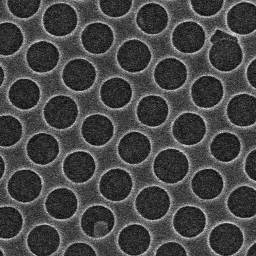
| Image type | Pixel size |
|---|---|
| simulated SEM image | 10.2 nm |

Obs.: a regular array of holes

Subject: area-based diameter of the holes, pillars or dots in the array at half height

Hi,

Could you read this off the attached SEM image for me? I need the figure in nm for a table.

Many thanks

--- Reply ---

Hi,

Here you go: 334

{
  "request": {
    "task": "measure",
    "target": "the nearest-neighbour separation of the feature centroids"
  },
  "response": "0.415 µm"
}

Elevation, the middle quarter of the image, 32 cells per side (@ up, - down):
-------@@@@@@@-------@@-------@@
--------@@@@@@@-----@@@--------@
--------@@@@@@@@@@@@@@---------@
--------@@@@--@@@@@@@@---------@
--------@@------@@@@@@@-------@@
@------@@--------@@@@@@@-----@@@
@@----@@@--------@@@@@@@@--@@@@@
@@@@@@@@@--------@@@@@@@@@@@@@@@
--@@@@@@@--------@@@-----@@@@@@@
---@@@@@@@------@@@-------@@@@@@
---@@@@@@@@----@@@--------@@@@@@
---@@@@@@@@@@@@@@@--------@@@@@@
---@@@@@@@@@@@@@@@--------@@@---
---@@@-----@@@@@@@--------@@----
---@@-------@@@@@@@------@@-----
--@@--------@@@@@@@@@---@@@-----
@@@@--------@@@@@@@@@@@@@@@-----
@@@@--------@@@@----@@@@@@@-----
@@@@@-------@@@------@@@@@@@----
@@@@@@-----@@@--------@@@@@@@---
@@@@@@@@-@@@@---------@@@@@@@@@@
@@@@@@@@@@@@@---------@@@----@@@
@-----@@@@@@@@-------@@@------@@
-------@@@@@@@-------@@--------@
--------@@@@@@@----@@@---------@
--------@@@@@@@@@@@@@@---------@
--------@@@----@@@@@@@---------@
-------@@@------@@@@@@@--------@
@------@@--------@@@@@@-------@@
@@---@@@@--------@@@@@@@@----@@@
@@@@@@@@@--------@@@@@-@@@@@@@@@
--@@@@@@@--------@@------@@@@@@@